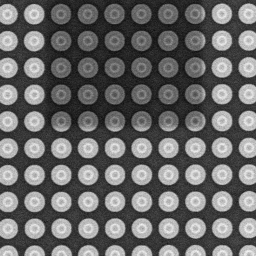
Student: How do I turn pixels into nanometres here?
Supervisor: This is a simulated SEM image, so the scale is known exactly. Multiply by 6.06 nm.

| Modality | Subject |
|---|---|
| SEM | an array of small figures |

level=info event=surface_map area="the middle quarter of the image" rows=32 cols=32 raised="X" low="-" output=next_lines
XX-XXXXX--XXXXX--XXXXX--XXXX--XX
XX-XXXXX--XXXXX--XXXXX--XXXX--XX
X---XXXX---XXXX--XXXX---XXXX---X
--------------------------------
--------------------------------
X----XX----XXX----XXX----XXX---X
XX--XXXX---XXXX--XXXXX--XXXX---X
XX--XXXX--XXXXX--XXXXX--XXXX--XX
XX--XXXX--XXXXX--XXXXX--XXXX--XX
X---XXXX---XXX----XXX---XXXX---X
--------------------------------
--------------------------------
X---XXXX---XXX----XXX---XXXX---X
XX--XXXX--XXXXX--XXXXX--XXXXX-XX
XX--XXXX--XXXXX--XXXXX--XXXXX-XX
XX--XXXX---XXXX--XXXXX--XXXX---X
X----XX----XXX----XXX----XX-----
--------------------------------
--------------------------------
X---XXXX---XXXX--XXXXX--XXXX---X
XX--XXXX--XXXXX--XXXXX--XXXXX-XX
XX--XXXX--XXXXX--XXXXX--XXXXX-XX
X---XXXX---XXXX--XXXXX--XXXX---X
--------------------------------
--------------------------------
-----XX-----XX----XXX----XXX---X
X---XXXX---XXXX--XXXXX--XXXX---X
XX--XXXX--XXXXX--XXXXX--XXXXX-XX
XX--XXXX--XXXXX--XXXXX--XXXXX-XX
X---XXXX---XXXX---XXX---XXXX---X
--------------------------------
--------------------------------